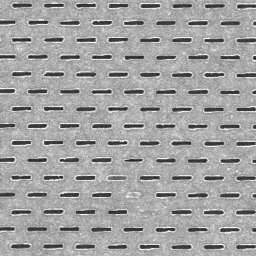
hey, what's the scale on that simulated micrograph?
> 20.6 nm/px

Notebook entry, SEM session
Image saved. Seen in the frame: a regular array of holes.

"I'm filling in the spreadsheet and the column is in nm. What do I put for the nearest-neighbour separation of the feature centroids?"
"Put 475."